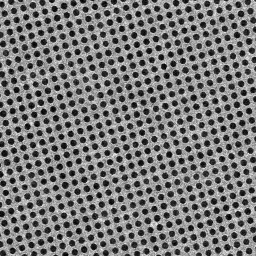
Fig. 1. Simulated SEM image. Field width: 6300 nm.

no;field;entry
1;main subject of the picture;a regular array of holes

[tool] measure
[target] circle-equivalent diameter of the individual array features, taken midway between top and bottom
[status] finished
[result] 6.96 pixels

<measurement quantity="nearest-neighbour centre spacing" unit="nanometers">234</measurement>